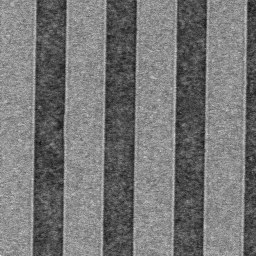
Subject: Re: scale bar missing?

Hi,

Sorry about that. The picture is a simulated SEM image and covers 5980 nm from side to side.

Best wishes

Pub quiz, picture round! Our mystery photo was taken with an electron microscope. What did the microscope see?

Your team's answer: one or a few lines or trenches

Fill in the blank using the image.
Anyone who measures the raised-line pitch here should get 1.64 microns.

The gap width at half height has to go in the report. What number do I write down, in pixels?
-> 31.8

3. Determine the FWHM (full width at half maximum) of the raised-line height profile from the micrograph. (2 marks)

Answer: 905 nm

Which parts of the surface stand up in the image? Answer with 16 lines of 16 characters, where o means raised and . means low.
oo..ooo..oo..oo.
oo..ooo..oo..oo.
oo..ooo..oo..oo.
oo..oo...oo..oo.
oo..oo...oo..oo.
oo..oo...oo..oo.
oo..oo...oo..oo.
oo..oo...oo..oo.
oo..oo...oo..oo.
oo..oo..ooo..oo.
oo..oo..ooo..oo.
oo..oo..ooo..oo.
oo..oo..ooo..oo.
oo..oo..ooo..oo.
oo..oo..ooo..oo.
oo..oo..ooo..oo.